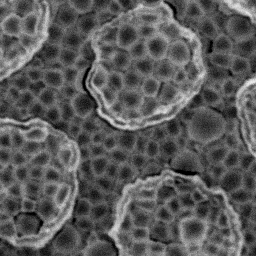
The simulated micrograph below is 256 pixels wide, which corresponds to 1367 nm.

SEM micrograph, raised bodies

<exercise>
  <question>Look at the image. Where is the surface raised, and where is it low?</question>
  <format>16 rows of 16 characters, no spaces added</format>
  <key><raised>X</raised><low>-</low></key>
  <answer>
XXX-----XXX----X
XXX----XXXX-----
XXX---XXXXXX----
XX----XXXXXXX---
X-----XXXXXXX---
-----XXXXXXXX--X
------XXXXXX---X
X------XXX-----X
XXXX-----------X
XXXXX-----------
XXXXX-----------
XXXXX---XXXXX---
XXXXX---XXXXXX--
XXXX---XXXXXXXX-
XXX----XXXXXXXX-
-------XXXXXXXX-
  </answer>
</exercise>